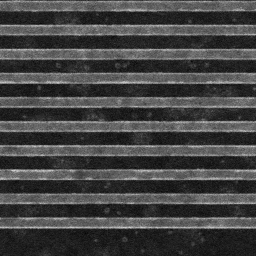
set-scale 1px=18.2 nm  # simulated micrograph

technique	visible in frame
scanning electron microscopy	parallel lines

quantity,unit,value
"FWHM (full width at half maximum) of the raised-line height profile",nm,175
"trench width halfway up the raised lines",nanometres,266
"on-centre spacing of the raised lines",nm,439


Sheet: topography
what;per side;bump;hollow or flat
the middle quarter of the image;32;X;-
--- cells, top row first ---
--------------------------------
--------------------------------
XXXXXXXXXXXXXXXXXXXXXXXXXXXXXXXX
XXXXXXXXXXXXXXXXXXXXXXXXXXXXXXXX
XXXXXXXXXXXXXXXXXXXXXXXXXXXXXXXX
--------------------------------
--------------------------------
--------------------------------
-----X--------------------------
XXXXXXXXXXXXXXXXXXXXXXXXXXXXXXXX
XXXXXXXXXXXXXXXXXXXXXXXXXXXXXXXX
---------------------------XX---
--------------------------------
--------------------------------
--------------X----------------X
XXXXXXXXXXXXXXXXXXXXXXXXXXXXXXXX
XXXXXXXXXXXXXXXXXXXXXXXXXXXXXXXX
--------------------------------
--------------------------------
--------------------------------
--------------------------------
XXXXXXXXXXXXXXXXXXXXXXXXXXXXXXXX
XXXXXXXXXXXXXXXXXXXXXXXXXXXXXXXX
--------------------------------
--------------------------------
--------------------------------
--------------------------------
XXXXXXXXXXXXXXXXXXXXXXXXXXXXXXXX
XXXXXXXXXXXXXXXXXXXXXXXXXXXXXXXX
--------------------------------
--------------------------------
--------------------------------